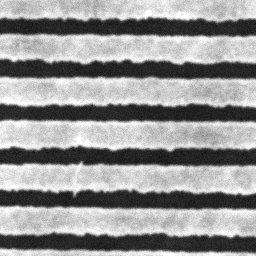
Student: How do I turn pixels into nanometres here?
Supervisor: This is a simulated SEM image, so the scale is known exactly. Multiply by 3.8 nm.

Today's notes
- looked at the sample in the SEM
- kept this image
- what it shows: lines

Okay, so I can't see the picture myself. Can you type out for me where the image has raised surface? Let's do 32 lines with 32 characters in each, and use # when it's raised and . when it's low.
################################
################################
..........................##....
................................
#######..###...#................
################################
################################
.....##########.################
................................
................................
################################
################################
################################
................................
................................
################################
################################
################################
...##........##...####....##..#.
................................
................................
################################
################################
################################
................................
................................
################################
################################
################################
............................#.##
................................
############..#..##.............